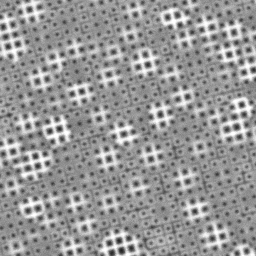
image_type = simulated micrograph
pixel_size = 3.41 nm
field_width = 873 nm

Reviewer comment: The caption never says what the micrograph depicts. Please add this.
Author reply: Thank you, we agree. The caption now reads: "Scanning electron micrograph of a regular array of holes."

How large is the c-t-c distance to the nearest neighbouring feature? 0.0335 microns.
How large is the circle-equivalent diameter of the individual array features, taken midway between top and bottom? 0.0128 um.